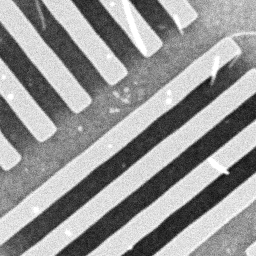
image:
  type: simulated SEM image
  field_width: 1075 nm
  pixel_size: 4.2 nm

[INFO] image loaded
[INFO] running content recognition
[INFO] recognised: groups of lines, slits or small figures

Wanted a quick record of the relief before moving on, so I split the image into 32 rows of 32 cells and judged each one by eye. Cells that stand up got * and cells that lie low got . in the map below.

**....***....***....****........
***...****....***....***........
***....****...****....**........
.***....***....****.............
..***....***....****............
..****....***....***.......***..
...****...****....*.......****..
....***....****..........****...
*....***....****.......*****....
**....***....***......*****...**
***...****...........****....***
***....****.........****....****
.***....***........****....****.
..***....**......****.....****..
..****..........****....****....
...****........****....****....*
....***.......****....****....**
*....*......****....*****....***
**.........****....****.....****
**........****....****....****..
**.......****....****....****...
.......****.....****....****....
......****....****.....****....*
.....****....****....****.....**
....****....****....****....****
..****.....****....****....****.
.****.....***.....****....****..
****....****....****.....****...
***....****....****....****.....
*.....****....****....****......
.....****....****....****.......
...****.....****....****.......*